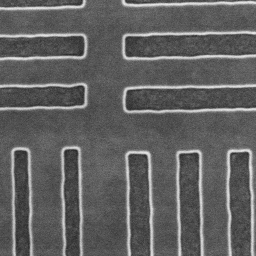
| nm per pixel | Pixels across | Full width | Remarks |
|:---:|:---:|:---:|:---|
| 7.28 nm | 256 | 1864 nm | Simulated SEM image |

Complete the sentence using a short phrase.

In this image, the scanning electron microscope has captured groups of lines, slits or small figures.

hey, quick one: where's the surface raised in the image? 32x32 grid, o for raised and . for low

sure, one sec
..........oooooo..........oooooo
oooooooooooooooooooooooooooooooo
oooooooooooooooooooooooooooooooo
oooooooooooooooooooooooooooooooo
ooooo.....oooooo................
...........oooo.................
...........ooooo................
oooooooooooooooooooooooooooooooo
oooooooooooooooooooooooooooooooo
oooooooooooooooooooooooooooooooo
oooooooooooooooooooooooooooooooo
...........ooooo................
...........ooooo................
....oooooooooooo................
oooooooooooooooooooooooooooooooo
oooooooooooooooooooooooooooooooo
oooooooooooooooooooooooooooooooo
oooooooooooooooooooooooooooooooo
oooooooooooooooooooooooooooooooo
oo..oooo..oooooo...ooo...oooo..o
oo..oooo..oooooo...ooo...oooo..o
oo..oooo..oooooo...ooo...oooo..o
oo..oooo..oooooo...ooo...oooo..o
oo..oooo..oooooo...ooo...ooo...o
oo..oooo..oooooo...ooo...oooo..o
oo..oooo..oooooo...ooo...oooo..o
oo..oooo..oooooo...ooo...oooo..o
oo..oooo..oooooo...ooo...oooo...
oo..oooo..oooooo...ooo...oooo..o
oo..oooo..oooooo...ooo...oooo...
oo..oooo..oooooo...oooo..oooo..o
oo..oooo..oooooo...oooo..oooo..o